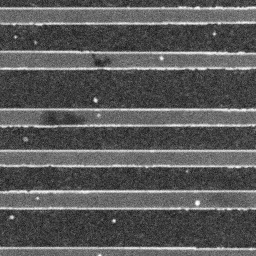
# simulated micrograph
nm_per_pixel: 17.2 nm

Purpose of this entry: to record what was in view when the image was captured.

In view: lines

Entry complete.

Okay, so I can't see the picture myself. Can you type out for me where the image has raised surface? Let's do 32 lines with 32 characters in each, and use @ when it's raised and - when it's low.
--------------------------------
@@@@@@@@@@@@@@@@@@@@@@@@@@@@@@@@
@@@@@@@@@@@@@@@@@@@@@@@@@@@@@@@@
--------------------------------
--------------------------------
--------------------------------
@@@@@@@@@@----------------------
@@@@@@@@@@@@@@@@@@@@@@@@@@@@@@@@
@@@@@@@@@@@@@@@@@@@@@@@@@@--@@@@
--------------------------------
--------------------------------
--------------------------------
--------------------------------
--------------------------------
@@@@@@@@@@@@@@@@@@@@@@@@@@@@@@@@
@@@@@@@@@@@@@@@@@@@@@@@@@@@@@@@@
--------------------------------
--------------------------------
--------------------------------
@@@@@@@@@@@@@@@@@@@@@@@@@@@@@@@@
@@@@@@@@@@@@@@@@@@@@@@@@@@@@@@@@
--------------------------------
--------------------------------
--------------------------------
@@@@@@@@@@@@@@@@@@@@@@@@@@@@@@@@
@@@@@@@@@@@@@@@@@@@@@@@@@@@@@@@@
--------------------------------
--------------------------------
--------------------------------
--------------------------------
--------------------------------
@@@@@@@@@@@@@@@@@@@@@@@@@@@@@@@@